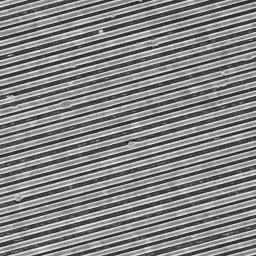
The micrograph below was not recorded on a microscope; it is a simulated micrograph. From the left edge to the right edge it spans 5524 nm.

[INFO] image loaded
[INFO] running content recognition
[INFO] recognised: parallel lines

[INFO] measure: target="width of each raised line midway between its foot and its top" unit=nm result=96.5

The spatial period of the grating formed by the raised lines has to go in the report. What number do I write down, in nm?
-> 205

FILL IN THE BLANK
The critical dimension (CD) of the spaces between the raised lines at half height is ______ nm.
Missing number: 115